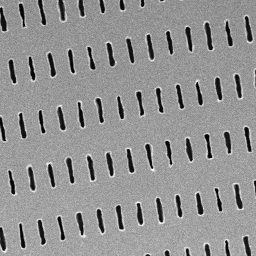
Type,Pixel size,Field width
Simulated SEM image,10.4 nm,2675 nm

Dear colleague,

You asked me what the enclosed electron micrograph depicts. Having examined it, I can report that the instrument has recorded a regular array of holes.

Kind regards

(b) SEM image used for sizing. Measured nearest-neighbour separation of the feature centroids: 207 nm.